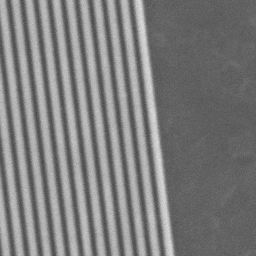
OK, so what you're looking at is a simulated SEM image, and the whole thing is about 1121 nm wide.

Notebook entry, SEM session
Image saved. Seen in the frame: parallel lines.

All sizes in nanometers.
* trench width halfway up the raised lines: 29.3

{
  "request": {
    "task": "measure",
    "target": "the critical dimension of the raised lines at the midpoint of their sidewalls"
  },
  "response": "0.0293 um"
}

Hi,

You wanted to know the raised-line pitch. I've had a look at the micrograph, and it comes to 59 nanometres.